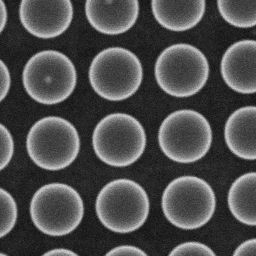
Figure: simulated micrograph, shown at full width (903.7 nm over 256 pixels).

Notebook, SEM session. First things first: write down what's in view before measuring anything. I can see an array of small figures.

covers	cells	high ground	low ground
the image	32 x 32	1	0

00011111100111111001111111011111
10111111100111111001111110011111
10011111100111111000111110001111
00011111000011110000011100000000
00000110000000000000000000000000
00000000000000000000000000000111
00000110000001110000111110001111
00001111100011111000111111001111
10011111100111111101111111001111
10011111100111111101111111001111
10011111100111111000111111001111
10011111100011111000011110000011
00001111000000000000000000000000
00000000000000000000000000000011
00000000000001110000011110000111
00001111100011111000111111001111
10001111110011111100111111001111
11011111110011111100111111001111
11011111110011111100111111000111
10001111100011111100011110000011
10000111100000110000000000000000
00000000000000000000000000000000
00000000000000010000001110000011
00000111100001111100011111000111
10001111110011111100111111100111
11001111110011111110111111100111
11001111110011111110111111100111
11001111110001111100011111000011
10000111100001111000000100000000
00000000000000000000000000000000
00000000000000000000000110000011
00000011100000111100011111000111